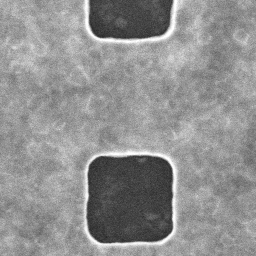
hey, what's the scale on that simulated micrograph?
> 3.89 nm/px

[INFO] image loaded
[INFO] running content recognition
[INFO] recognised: holes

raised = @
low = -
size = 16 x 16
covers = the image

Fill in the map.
@@@@@------@@@@@
@@@@@@-----@@@@@
@@@@@@@@@@@@@@@@
@@@@@@@@@@@@@@@@
@@@@@@@@@@@@@@@@
@@@@@@@@@@@@@@@@
@@@@@@@@@@@@@@@@
@@@@@@@@@@@@@@@@
@@@@@@@@@@@@@@@@
@@@@@@@@@@@@@@@@
@@@@@@-----@@@@@
@@@@@------@@@@@
@@@@@------@@@@@
@@@@@------@@@@@
@@@@@@-----@@@@@
@@@@@@@@@@@@@@@@